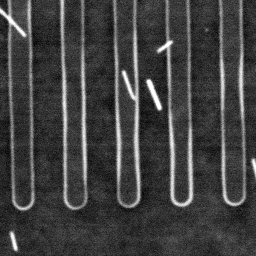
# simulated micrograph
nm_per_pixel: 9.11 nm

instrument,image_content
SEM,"groups of lines, slits or small figures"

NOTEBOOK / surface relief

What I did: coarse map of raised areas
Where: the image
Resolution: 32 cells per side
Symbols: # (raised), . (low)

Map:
.###....##....###....##.....##..
.###....##....###....###....##..
.###....##....###....###....##..
.###....##....###....###....##..
.###....##....###....###....##..
.###....##....###....###....##..
.###....##....###....###....##..
.###....##.....##....###....##..
.###....##.....##....###....##..
.###....##.....##....###....##..
.###....##.....##....###....##..
.###....##.....##....###....##..
.###....##.....##....###....##..
.###....##.....##....###....##..
.###....##.....##....###....##..
.###....##.....##....###....##..
..##....##.....##....###....##..
..##....###....##....###....###.
..##....###....##.....##....###.
..##....###....##.....##....###.
..##....###....##.....##....###.
..##....###....##.....##....###.
..##....###....##.....##....###.
..##....###....##.....##....###.
..##....###....##.....##....###.
..##....###....##.....#......#..
................................
................................
................................
................................
................................
................................